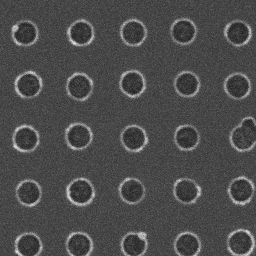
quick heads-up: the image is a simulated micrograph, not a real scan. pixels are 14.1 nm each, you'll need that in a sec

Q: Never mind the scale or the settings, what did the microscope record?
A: a regular array of holes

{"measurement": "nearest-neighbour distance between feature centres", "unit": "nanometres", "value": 727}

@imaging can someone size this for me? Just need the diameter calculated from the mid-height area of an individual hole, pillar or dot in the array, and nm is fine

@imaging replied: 322